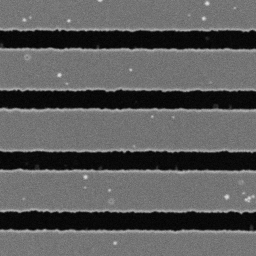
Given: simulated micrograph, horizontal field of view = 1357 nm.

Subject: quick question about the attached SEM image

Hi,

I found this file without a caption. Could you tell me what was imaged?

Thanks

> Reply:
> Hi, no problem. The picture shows lines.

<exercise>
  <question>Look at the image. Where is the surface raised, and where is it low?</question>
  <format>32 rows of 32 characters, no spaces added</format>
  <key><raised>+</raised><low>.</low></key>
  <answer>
++++++++++++++++++++++++++++++++
++++++++++++++++++++++++++++++++
++++++++++++++++++++++++++++++++
++++++++++++++++++++++++++++++++
................................
................................
++++++++++++++++++++++++++++++++
++++++++++++++++++++++++++++++++
++++++++++++++++++++++++++++++++
++++++++++++++++++++++++++++++++
++++++++++++++++++++++++++++++++
................................
................................
+...............................
++++++++++++++++++++++++++++++++
++++++++++++++++++++++++++++++++
++++++++++++++++++++++++++++++++
++++++++++++++++++++++++++++++++
++++++++++++++++++++++++++++++++
................................
................................
++++++++++++++++++++++++++++++++
++++++++++++++++++++++++++++++++
++++++++++++++++++++++++++++++++
++++++++++++++++++++++++++++++++
++++++++++++++++++++++++++++++++
+.+...++.+.++.+++++.++++.+++++++
................................
................................
++++++++++++++++++++++++++++++++
++++++++++++++++++++++++++++++++
++++++++++++++++++++++++++++++++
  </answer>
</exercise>